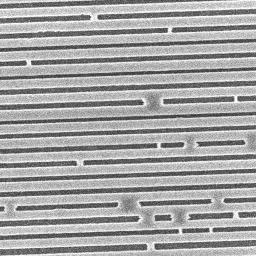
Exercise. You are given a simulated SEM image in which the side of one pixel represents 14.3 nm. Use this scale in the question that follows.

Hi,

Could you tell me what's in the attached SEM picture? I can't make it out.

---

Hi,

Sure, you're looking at parallel lines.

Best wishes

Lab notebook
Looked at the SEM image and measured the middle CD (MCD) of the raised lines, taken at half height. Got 125 nm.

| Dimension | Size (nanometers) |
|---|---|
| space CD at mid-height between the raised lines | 85.9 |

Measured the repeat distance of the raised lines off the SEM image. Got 207 nm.